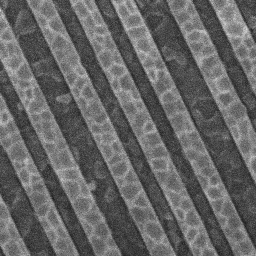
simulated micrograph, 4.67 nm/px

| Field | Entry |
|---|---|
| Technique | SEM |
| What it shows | parallel lines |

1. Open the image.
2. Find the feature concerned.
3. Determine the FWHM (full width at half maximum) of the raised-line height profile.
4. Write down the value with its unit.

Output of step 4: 102 nanometers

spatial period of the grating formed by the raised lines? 192 nanometres